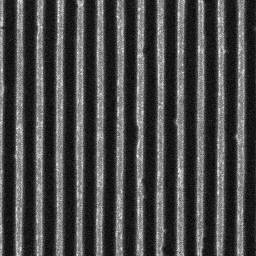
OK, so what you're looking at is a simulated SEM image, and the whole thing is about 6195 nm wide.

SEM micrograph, parallel lines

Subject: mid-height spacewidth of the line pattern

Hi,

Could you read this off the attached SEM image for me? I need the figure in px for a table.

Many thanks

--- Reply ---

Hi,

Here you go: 13.1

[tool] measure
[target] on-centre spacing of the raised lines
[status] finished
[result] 487 nanometres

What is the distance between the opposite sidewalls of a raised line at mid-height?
182 nm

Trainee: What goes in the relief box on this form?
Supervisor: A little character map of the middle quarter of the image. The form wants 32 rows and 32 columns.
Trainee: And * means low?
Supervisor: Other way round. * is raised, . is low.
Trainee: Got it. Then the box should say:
...**...**...**...**...**...**..
...**...**...**...**...**...**..
...**...**...**...**...**...**..
...**...**...**...**...**...**..
...**...**...**...**...**...**..
...**...**...**...**...**...**..
...**...**...**...**...**...**..
...**...**...**...**...**...**..
...**...**...**...**...**...**..
...**...**...**...**...**...**..
...**...**...**...**...**...**..
...**...**...**...**...**...**..
...**...**...**...**...**...**..
...**...**...**...**...**...**..
...**...**...**...**...**...**..
...**...**...**...**...**...**..
...**...**...**....*...**...**..
...**...**...**...**...**...**..
...**...**...**...**...**...**..
...**...**...**...**...**...**..
...**...**...**...**...**...**..
...**...**...**...**...**...**..
...**...**...**...**...**...**..
...**...**...**...**...**...**..
...**...**...**...**...**...**..
...**...**...**...**...**...**..
...**...**...**...**...**...**..
...**...**...**...**...**...**..
...**...**...**...**...**...**..
...**...**...**...**...**...**..
...**...**...**...**...**...**..
...**...**...**...**...**...**..